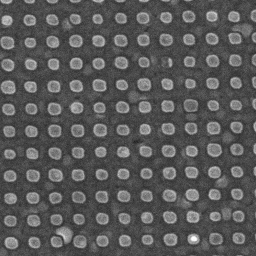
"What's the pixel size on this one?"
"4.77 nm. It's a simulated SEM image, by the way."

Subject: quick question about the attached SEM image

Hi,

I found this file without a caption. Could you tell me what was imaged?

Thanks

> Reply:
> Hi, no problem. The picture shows a regular array of raised bodies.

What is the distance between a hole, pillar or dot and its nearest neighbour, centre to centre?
105 nanometers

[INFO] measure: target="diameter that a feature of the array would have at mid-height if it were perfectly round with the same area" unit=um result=0.0548